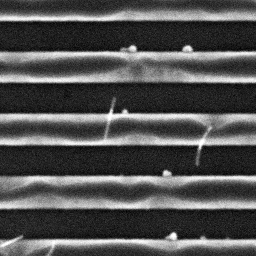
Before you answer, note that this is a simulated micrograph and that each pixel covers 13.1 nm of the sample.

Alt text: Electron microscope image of lines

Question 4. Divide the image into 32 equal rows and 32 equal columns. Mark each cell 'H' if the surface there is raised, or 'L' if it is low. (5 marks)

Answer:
HHHHHHHHHHHHHHHHHHHHHHHHHHHHHHHH
HHHHHHHHHHHHHHHHHHHHHHHHHHHHHHHH
LLLLLLLLLLLLLLLLLLLLLLLLLLLLLLLL
LLLLLLLLLLLLLLLLLLLLLLLLLLLLLLLL
LLLLLLLLLLLLLLLLLLLLLLLLLLLLLLLL
LLLLLLLLLLLLLLLLLLLLLLLLLLLLLLLL
LLLLLLLLLLLLLLLLLLLLLLLLLLLLLLLL
HHHHHHHHHHHHHHHHHHHHHHHHHHHHHHHH
HHHHHHHHHHHHHHHHHHHHHHHHHHHHHHHH
HHHHHHHHHHHHHHHHLLHHHHHHHHHHHHHH
LLLLLLLLLLLLLLLLLLLLLLLLLLLLLLLL
LLLLLLLLLLLLLLLLLLLLLLLLLLLLLLLL
LLLLLLLLLLLLLLLLLLLLLLLLLLLLLLLL
LLLLLLLLLLLLLLLLLLLLLLLLLLLLLLLL
LLLLLLLLLLLLLHHHHLLLLLLLLLLLLLLL
HHHHHHHHHHHHHHHHHHHHHHHHHHHHHHHH
HHHHHHHHHHHHHHHHHHHHHHHHHHHHHHHH
HHHHHHHHHHHHHHHHHHHHHHHHHHHHHHHH
LLLLLLLLLLLLLLLLLLLLLLLLLLLLLLLL
LLLLLLLLLLLLLLLLLLLLLLLLLLLLLLLL
LLLLLLLLLLLLLLLLLLLLLLLLLLLLLLLL
LLLLLLLLLLLLLLLLLLLLLLLLLLLLLLLL
LLLHHHHHHHHHHHHHHHHHHHHHHHHHHHHH
HHHHHHHHHHHHHHHHHHHHHHHHHHHHHHHH
HHHHHHHHHHHHHHHHHHHHHHHHHHHHHHHH
HHHHHLLHHHHHHHHHHHHHHHHHHHHHHHHH
LLLLLLLLLLLLLLLLLLLLLLLLLLLLLLLL
LLLLLLLLLLLLLLLLLLLLLLLLLLLLLLLL
LLLLLLLLLLLLLLLLLLLLLLLLLLLLLLLL
LLLLLLLLLLLLLLLLLLLLLLLLLLLLLLLL
HLLLHHHHHHHHHHHHHHHHHHHHHHHHHHHH
HHHHHHHHHHHHHHHHHHHHHHHHHHHHHHHH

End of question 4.